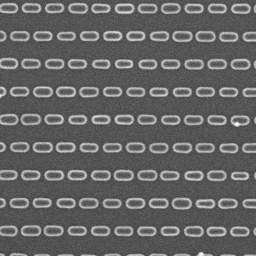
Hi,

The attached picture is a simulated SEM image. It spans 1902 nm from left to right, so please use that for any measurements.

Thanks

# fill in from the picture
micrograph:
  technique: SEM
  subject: groups of lines, slits or small figures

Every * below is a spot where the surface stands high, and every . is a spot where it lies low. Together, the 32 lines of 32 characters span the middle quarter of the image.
.****..****..****..****..****.**
................................
................................
................................
................................
................................
***.****..****..****..****..****
***.****..****..****..****.*****
................................
................................
................................
................................
................................
.****..****..****..****..****.**
..***..****..****..****..****.**
................................
................................
................................
................................
................................
***.****..****..****..****.*****
**..****..****..****..****..****
................................
................................
................................
................................
................................
.****..****..****..****.****...*
.****..****..****..****.****...*
................................
................................
................................